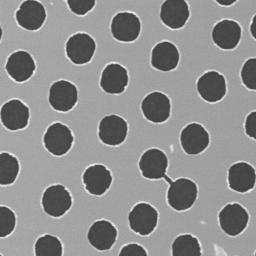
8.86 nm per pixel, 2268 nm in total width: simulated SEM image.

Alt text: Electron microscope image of a regular array of holes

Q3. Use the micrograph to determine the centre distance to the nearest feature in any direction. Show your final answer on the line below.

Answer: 0.434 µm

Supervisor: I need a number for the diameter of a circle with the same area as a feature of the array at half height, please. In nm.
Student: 262